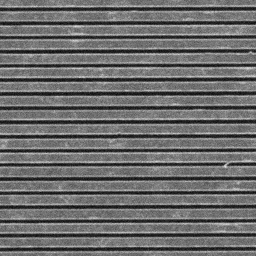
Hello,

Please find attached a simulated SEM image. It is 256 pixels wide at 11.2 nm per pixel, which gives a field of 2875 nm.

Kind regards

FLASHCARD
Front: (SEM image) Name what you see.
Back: parallel lines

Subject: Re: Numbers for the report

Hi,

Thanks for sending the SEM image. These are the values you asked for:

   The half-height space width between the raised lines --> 49.1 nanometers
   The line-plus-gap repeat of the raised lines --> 159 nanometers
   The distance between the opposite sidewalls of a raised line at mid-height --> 0.107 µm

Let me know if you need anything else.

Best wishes